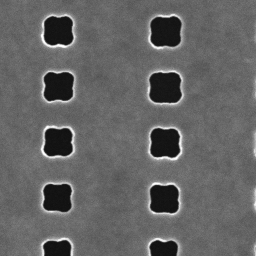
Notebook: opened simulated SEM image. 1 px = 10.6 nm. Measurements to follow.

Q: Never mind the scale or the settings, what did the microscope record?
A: a regular array of holes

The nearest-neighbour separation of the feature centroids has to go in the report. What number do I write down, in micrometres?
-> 0.588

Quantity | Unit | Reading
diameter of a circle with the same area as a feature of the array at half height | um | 0.335